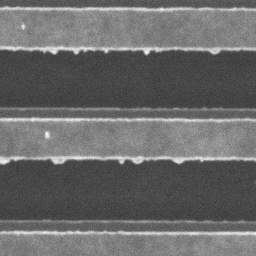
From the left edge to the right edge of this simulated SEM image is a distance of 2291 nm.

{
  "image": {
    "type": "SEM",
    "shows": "lines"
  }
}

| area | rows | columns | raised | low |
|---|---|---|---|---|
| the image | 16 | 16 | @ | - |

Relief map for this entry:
@@@@@@@@@@@@@@@@
@@@@@@@@@@@@@@@@
@@@@@@@@@@@@@@@@
----------------
----------------
----------------
----------------
@@@@@@@@@@@@@@@@
@@@@@@@@@@@@@@@@
@@@@@@@@@@@@@@@@
----------------
----------------
----------------
----------------
@@@@@@@@@@@@@@@@
@@@@@@@@@@@@@@@@